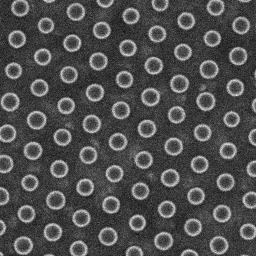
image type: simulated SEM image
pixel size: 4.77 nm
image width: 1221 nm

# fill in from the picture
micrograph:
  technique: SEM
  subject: a regular array of raised bodies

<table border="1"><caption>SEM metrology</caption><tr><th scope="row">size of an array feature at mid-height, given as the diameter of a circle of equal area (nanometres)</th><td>77.4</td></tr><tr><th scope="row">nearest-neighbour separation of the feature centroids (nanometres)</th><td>149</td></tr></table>